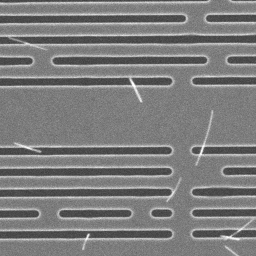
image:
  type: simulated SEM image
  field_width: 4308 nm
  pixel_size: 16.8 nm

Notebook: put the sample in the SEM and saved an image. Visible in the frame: groups of lines, slits or small figures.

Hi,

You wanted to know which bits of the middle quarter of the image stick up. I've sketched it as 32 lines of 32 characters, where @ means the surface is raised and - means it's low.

@@@@@@@@@@@@@@@@@@@@@@@@@@@@@@@@
@@@@@@@@@@@@@@@@@@@@@@@@@@@@@@@@
@@@@@@@@@@@@@@@@@@@@@@@@@@@@@@@@
---------------------------@@@@@
---------------------------@@@@@
-------@@@@@@@@@@@@@@@----@@@@@@
@@@@@@@@@@@@@@@@@@@@@@@@@@@@@@@@
@@@@@@@@@@@@@@@@@@@@@@@@@@@@@@@@
@@@@@@@@@@@@@@@@@@@@@@@@@@@@@@@@
@@@@@@@@@@@@@@@@@@@@@@@@@@@@@@@@
@@@@@@@@@@@@@@@@@@@@@@@@@@@@@@@@
@@@@@@@@@@@@@@@@@@@@@@@@@@@@@@@@
@@@@@@@@@@@@@@@@@@@@@@@@@@@@@@@@
@@@@@@@@@@@@@@@@@@@@@@@@@@@@@@@@
@@@@@@@@@@@@@@@@@@@@@@@@@@@@@@@@
@@@@@@@@@@@@@@@@@@@@@@@@@@@@@@@@
@@@@@@@@@@@@@@@@@@@@@@@@@@@@@@@@
@@@@@@@@@@@@@@@@@@@@@@@@@@@@@@@@
@@@@@@@@@@@@@@@@@@@@@@@@@@@@@@@@
@@@@@@@@@@@@@@@@@@@@@@@@@@@@@@@@
@@@@@@@@@@@@@@@@@@@@@@@@@@@@@@@@
---------------------------@@@@@
---------------------------@@@@@
@@@@@@@@@@@@@@@@@@@@@@@@@@@@@@@@
@@@@@@@@@@@@@@@@@@@@@@@@@@@@@@@@
@@@@@@@@@@@@@@@@@@@@@@@@@@@@@@@@
---------------------------@@@@@
---------------------------@@@@@
@@@@@@@@@@@@@@@@@@@@@@@@@@@@@@@@
@@@@@@@@@@@@@@@@@@@@@@@@@@@@@@@@
@@@@@@@@@@@@@@@@@@@@@@@@@@@@@@@@
---------------------------@@@@@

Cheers